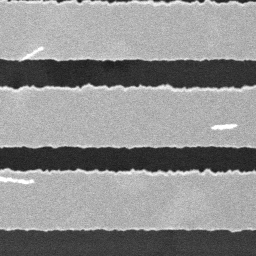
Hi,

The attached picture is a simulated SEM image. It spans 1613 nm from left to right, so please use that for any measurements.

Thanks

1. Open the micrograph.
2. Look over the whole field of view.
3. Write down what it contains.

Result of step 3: lines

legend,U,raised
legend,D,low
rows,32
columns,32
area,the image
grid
UUUUUUUUUUUUUUUUUUUUUUUUUUUUUUUU
UUUUUUUUUUUUUUUUUUUUUUUUUUUUUUUU
UUUUUUUUUUUUUUUUUUUUUUUUUUUUUUUU
UUUUUUUUUUUUUUUUUUUUUUUUUUUUUUUU
UUUUUUUUUUUUUUUUUUUUUUUUUUUUUUUU
UUUUUUUUUUUUUUUUUUUUUUUUUUUUUUUU
UUUUUUUUUUUUUUUUUUUUUUUUUUUUUUUU
DDUDDDDUDDDDDDUDDDUDDUDDDDDDDDUD
DDDDDDDDDDDDDDDDDDDDDDDDDDDDDDDD
DDDDDDDDDDDDDDDDDDDDDDDDDDDDDDDD
DDDDDDDDDDDDDDDDDDDDDDDDDDDDDDDD
UUUUUUUUUUUUUUUUUUUUUUUUUUUUUUUU
UUUUUUUUUUUUUUUUUUUUUUUUUUUUUUUU
UUUUUUUUUUUUUUUUUUUUUUUUUUUUUUUU
UUUUUUUUUUUUUUUUUUUUUUUUUUUUUUUU
UUUUUUUUUUUUUUUUUUUUUUUUUUUUUUUU
UUUUUUUUUUUUUUUUUUUUUUUUUUUUUUUU
UUUUUUUUUUUUUUUUUUUUUUUUUUUUUUUU
DDDDDDDDDDDDDDDDDDDDDDDDDDDDDDDD
DDDDDDDDDDDDDDDDDDDDDDDDDDDDDDDD
DDDDDDDDDDDDDDDDDDDDDDDDDDDDDDDD
UUUUUUUUUUUUUUDUUUUDDUUUUUUDUUDU
UUUUUUUUUUUUUUUUUUUUUUUUUUUUUUUU
UUUUUUUUUUUUUUUUUUUUUUUUUUUUUUUU
UUUUUUUUUUUUUUUUUUUUUUUUUUUUUUUU
UUUUUUUUUUUUUUUUUUUUUUUUUUUUUUUU
UUUUUUUUUUUUUUUUUUUUUUUUUUUUUUUU
UUUUUUUUUUUUUUUUUUUUUUUUUUUUUUUU
UUUUUUUUUUUUUUUUUUUUUUUUUUUUUUUU
DDDDDDDDDDDDDDDDDDDDDDDDDDDDDDDD
DDDDDDDDDDDDDDDDDDDDDDDDDDDDDDDD
DDDDDDDDDDDDDDDDDDDDDDDDDDDDDDDD